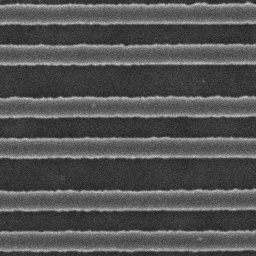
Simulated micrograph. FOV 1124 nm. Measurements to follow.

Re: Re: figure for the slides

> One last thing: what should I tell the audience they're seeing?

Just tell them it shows lines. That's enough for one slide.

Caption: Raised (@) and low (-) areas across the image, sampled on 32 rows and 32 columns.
-------------------------@-----@
@@@@@@@@@@@@@@@@@@@@@@@@@@@@@@@@
@@@@@@@@@@@@@@@@@@@@@@@@@@@@@@@@
--------------------------------
--------------------------------
--------------------------------
@@@@@@@@@@@@@@@@@@@@@@@@@@@@@@@@
@@@@@@@@@@@@@@@@@@@@@@@@@@@@@@@@
--------------------------------
--------------------------------
--------------------------------
--------------------------------
@@@@@@@@@@@@@@@@@@@@@@@@@@@@@@@@
@@@@@@@@@@@@@@@@@@@@@@@@@@@@@@@@
@@@@@@@@@@@@@@@@@@@@-@@@@@@@@@--
--------------------------------
--------------------------------
@@@@@@@@@@@@@@@@@@@@@@@@@@@@@@@@
@@@@@@@@@@@@@@@@@@@@@@@@@@@@@@@@
@@@@@@@@@@@@@@@@@@@@@@@@@@@@@@@@
--------------------------------
--------------------------------
--------------------------------
--------------------------------
@@@@@@@@@@@@@@@@@@@@@@@@@@@@@@@@
@@@@@@@@@@@@@@@@@@@@@@@@@@@@@@@@
--------------------------------
--------------------------------
--------------------------------
@@@@@@@@@@@@@@@@@@@@@@@@@@@@@@@@
@@@@@@@@@@@@@@@@@@@@@@@@@@@@@@@@
--------------------------------